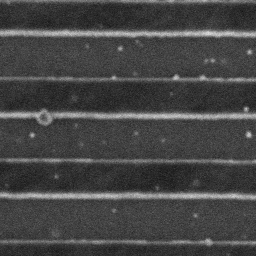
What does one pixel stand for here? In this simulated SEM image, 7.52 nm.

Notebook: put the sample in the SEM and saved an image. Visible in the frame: lines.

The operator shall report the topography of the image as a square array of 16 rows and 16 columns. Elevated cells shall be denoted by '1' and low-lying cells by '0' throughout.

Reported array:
1111111111111111
1111111111111111
0000000000000000
0000000000000000
0000000000000000
1111111111111111
1111111111111111
0010000000000000
0000000000000000
0000000000000000
1111111111111111
1111111111111111
0000000000000000
0000000000000000
0000000000000000
1111111111111111